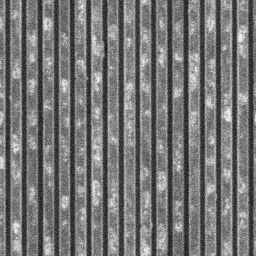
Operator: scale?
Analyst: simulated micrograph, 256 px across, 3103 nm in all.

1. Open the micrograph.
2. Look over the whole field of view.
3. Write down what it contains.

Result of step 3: parallel lines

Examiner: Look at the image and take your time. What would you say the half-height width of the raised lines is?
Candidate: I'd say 121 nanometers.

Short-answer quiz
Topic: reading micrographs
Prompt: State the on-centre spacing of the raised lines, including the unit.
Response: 196 nm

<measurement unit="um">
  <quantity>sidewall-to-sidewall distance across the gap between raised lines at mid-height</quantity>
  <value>0.0727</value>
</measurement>